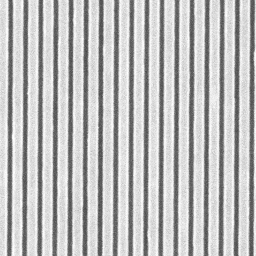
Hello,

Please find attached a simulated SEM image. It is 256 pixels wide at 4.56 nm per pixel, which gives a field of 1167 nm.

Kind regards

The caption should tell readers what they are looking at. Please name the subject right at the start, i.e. parallel lines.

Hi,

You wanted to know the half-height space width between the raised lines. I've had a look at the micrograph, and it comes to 23.4 nanometres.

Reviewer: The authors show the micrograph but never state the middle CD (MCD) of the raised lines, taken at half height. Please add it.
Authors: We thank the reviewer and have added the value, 0.0456 micrometres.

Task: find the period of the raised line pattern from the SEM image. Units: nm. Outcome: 69